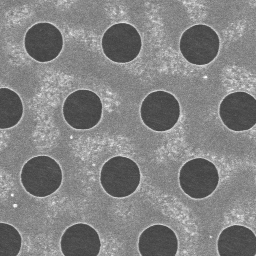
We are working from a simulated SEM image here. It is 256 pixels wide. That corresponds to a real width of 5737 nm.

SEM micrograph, a regular array of holes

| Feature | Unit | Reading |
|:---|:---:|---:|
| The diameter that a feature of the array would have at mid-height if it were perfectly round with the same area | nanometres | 897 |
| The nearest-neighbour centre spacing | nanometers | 1730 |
